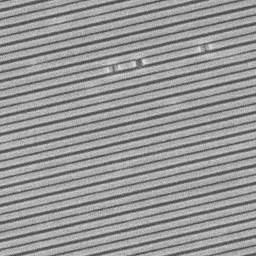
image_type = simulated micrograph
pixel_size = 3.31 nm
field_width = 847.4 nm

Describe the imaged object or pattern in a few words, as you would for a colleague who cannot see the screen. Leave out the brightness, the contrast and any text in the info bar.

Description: parallel lines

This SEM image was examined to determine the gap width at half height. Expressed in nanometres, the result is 9.6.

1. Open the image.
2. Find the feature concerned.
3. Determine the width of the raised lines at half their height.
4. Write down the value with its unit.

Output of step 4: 19.8 nm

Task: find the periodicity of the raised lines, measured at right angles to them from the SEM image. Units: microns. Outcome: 0.0286